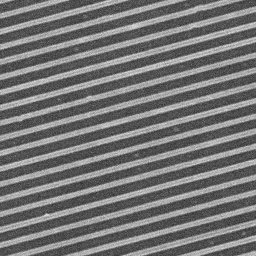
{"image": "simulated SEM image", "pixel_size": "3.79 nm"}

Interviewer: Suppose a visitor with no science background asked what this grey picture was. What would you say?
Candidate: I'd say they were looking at parallel lines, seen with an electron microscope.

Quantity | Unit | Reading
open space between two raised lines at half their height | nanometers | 38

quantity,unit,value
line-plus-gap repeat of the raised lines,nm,55.8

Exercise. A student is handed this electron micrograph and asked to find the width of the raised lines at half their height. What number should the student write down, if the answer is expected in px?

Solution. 4.59